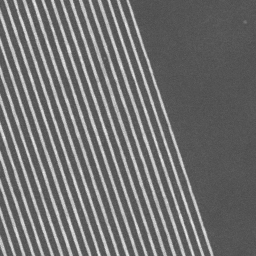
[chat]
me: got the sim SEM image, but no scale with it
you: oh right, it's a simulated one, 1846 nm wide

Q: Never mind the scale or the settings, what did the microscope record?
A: parallel lines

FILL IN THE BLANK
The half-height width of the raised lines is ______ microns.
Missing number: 0.0154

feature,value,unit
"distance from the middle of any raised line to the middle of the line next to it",0.0644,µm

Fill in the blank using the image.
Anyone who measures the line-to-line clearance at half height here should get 47.1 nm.